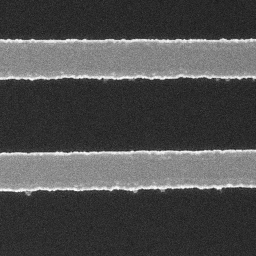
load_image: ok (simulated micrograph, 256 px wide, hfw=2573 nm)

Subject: lines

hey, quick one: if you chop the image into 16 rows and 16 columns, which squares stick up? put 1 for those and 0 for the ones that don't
0000000000000000
0000000000000000
1110111111011111
1111111111111111
1111111111111111
0000000000000000
0000000000000000
0000000000000000
0000000000000000
0000000011111111
1111111111111111
1111111111111111
0000000000000000
0000000000000000
0000000000000000
0000000000000000